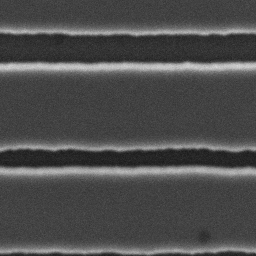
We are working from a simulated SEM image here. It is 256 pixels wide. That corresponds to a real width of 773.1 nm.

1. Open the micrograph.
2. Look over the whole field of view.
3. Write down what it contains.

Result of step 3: lines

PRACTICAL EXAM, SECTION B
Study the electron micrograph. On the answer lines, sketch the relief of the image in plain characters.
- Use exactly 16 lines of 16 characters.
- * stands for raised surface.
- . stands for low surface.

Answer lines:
****************
****************
................
................
****************
****************
****************
****************
****************
................
................
****************
****************
****************
****************
****************